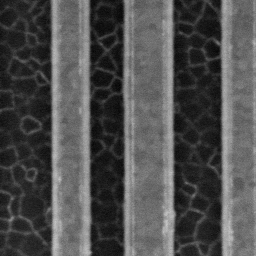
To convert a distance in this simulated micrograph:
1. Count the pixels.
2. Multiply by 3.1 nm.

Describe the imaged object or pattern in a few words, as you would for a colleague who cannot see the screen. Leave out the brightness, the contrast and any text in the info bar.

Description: one or a few lines or trenches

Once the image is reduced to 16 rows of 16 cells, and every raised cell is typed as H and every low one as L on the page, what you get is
LLLHHLLLHHHLLLHH
LLLHHLLLHHHLLLHH
LLLHHLLLHHHLLLHH
LLLHHLLLHHHLLLHH
LLLHHLLLHHHLLLHH
LLLHHLLLHHHLLLHH
LLLHHLLLHHHLLLHH
LLLHHLLLHHHLLLHH
LLLHHLLLHHHLLLHH
LLLHHLLLHHHLLLHH
LLLHHLLLHHHLLLHH
LLLHHLLLHHHLLLHH
LLLHHLLLHHHLLLHH
LLLHHLLLHHHLLLHH
LLLHHLLLHHHLLLHH
LLLHHLLLHHHLLLHH